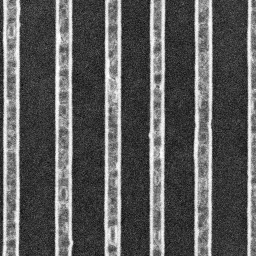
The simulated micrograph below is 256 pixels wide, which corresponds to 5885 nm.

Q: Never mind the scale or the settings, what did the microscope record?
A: parallel lines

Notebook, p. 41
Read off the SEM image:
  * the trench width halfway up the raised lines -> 0.822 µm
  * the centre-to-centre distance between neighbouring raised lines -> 1100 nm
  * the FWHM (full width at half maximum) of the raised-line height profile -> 313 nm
